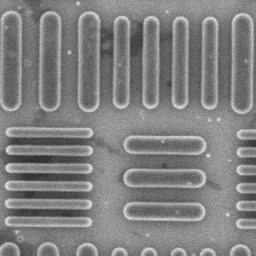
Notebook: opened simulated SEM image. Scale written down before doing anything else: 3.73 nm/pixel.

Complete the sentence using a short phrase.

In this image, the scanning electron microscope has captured groups of lines, slits or small figures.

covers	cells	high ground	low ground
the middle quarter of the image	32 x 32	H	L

LLLLHHHHHLLLHHHHLLLLHHHHLLLHHHHL
LLLLHHHHHLLLHHHHLLLLHHHHLLLHHHHL
LLLLHHHHHLLLHHHHLLLLHHHHLLLHHHHL
LLLLHHHHHLLLHHHHLLLLHHHHLLLHHHHL
LLLLHHHHHLLLHHHHLLLLHHHHLLLHHHHL
LLLLHHHHHLLLHHHHLLLLHHHHLLLHHHHL
LLLLHHHHHLLLHHHHLLLLHHHLLLLHHHHL
LLLLHHHHHLLLHHHHLLLLHHHLLLLHHHHL
LLLLHHHHHLLLHHHHLLLLHHHLLLLHHHHL
LLLLHHHHHLLLHHHHLLLLHHHLLLLHHHHL
LLLLHHHHLLLLLHHHLLLLHHHLLLLLHHLL
LLLLLHHHLLLLLLLLLLLLLLLLLLLLLLLL
LLLLLLLLLLLLLLLLLLLLLLLLLLLLLLLL
LLLLLLLLLLLLLLLLLLLLLLLLLLLLLLLL
LLLLLLLLLLLLLLLLLLLLLLLLLLLLLLLL
LLLLLLLLLLLLLLLLLLLLLLLLLLLLLLLL
HHHHHHHLLLLLLLLLLLLLLLLLLLLLLLLL
HHHHHHHLLLLLLLLLLLLLLLLLLLLLLLLL
LLLLLLLLLLLLLLLLHHHHHHHHHHHHHHHH
LLLLLLLLLLLLLLLHHHHHHHHHHHHHHHHH
LLLLLLLLLLLLLLLHHHHHHHHHHHHHHHHH
HHHHHHHLLLLLLLLHHHHHHHHHHHHHHHHH
HHHHHHHLLLLLLLLLLLLLLLLLLLLLLLLL
LLLLLLLLLLLLLLLLLLLLLLLLLLLLLLLL
LLLLLLLLLLLLLLLLLLLLLLLLLLLLLLLL
HHHHHHHLLLLLLLLLLLLLLLLLLLLLLLLL
HHHHHHHLLLLLLLLLHHHHHHHLLLLLLLLL
LLLLLLLLLLLLLLLHHHHHHHHHHHHHHHHH
LLLLLLLLLLLLLLLHHHHHHHHHHHHHHHHH
LLLLLLLLLLLLLLLHHHHHHHHHHHHHHHHH
HHHHHHHLLLLLLLLLHHHHHHHHHHHHHHHH
HHHHHHLLLLLLLLLLLLLLLLLLLLLLLLLL